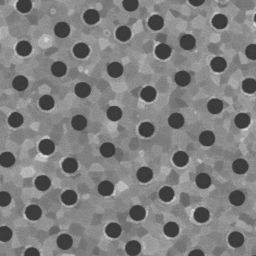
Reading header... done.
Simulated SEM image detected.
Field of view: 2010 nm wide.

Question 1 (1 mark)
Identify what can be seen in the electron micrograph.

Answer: a regular array of holes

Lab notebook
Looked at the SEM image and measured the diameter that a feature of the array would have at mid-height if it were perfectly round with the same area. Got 126 nanometres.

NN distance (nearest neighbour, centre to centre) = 0.249 µm